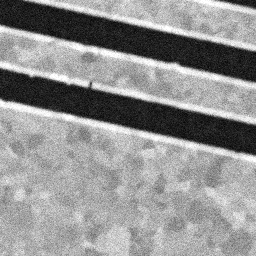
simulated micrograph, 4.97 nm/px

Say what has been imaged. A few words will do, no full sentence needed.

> one or a few lines or trenches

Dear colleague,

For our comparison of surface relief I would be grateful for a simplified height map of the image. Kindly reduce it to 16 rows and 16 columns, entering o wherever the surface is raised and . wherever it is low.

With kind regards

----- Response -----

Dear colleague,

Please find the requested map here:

....ooooooooooo.
.........ooooooo
ooo..........ooo
oooooooo........
..oooooooooo....
......oooooooooo
...........ooooo
ooooo..........o
oooooooooo......
oooooooooooooo..
oooooooooooooooo
oooooooooooooooo
oooooooooooooooo
oooooooooooooooo
oooooooooooooooo
oooooooooooooooo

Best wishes